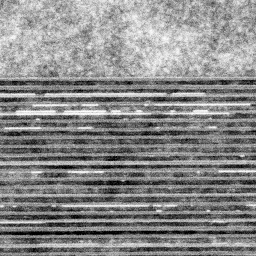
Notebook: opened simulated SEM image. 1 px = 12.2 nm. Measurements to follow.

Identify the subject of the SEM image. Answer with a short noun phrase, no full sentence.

parallel lines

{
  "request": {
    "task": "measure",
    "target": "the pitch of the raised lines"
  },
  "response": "101 nm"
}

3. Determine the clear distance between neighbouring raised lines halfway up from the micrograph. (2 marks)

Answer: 0.0701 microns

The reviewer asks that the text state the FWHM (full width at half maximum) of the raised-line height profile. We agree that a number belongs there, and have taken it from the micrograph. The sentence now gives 0.0351 µm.